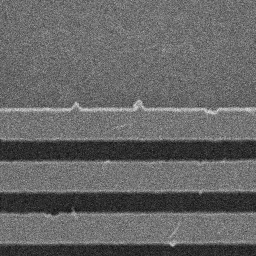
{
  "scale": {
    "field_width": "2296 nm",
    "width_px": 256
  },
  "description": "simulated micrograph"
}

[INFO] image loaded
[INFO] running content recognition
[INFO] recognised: parallel lines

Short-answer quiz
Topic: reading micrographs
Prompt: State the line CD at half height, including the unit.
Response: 0.276 micrometres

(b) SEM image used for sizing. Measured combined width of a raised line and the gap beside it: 0.466 µm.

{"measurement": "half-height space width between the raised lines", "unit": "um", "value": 0.19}